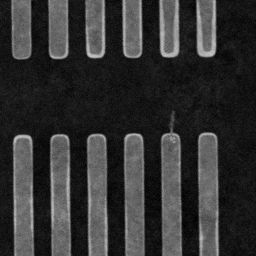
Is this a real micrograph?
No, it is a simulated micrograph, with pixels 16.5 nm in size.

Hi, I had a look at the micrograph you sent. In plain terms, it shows groups of lines, slits or small figures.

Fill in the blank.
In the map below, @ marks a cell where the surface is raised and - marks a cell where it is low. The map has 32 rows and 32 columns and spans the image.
--@@--@@---@@---@@--@@---@@-----
--@@--@@---@@---@@--@@---@@-----
--@@--@@---@@---@@--@@---@@-----
--@@--@@---@@---@@--@@---@@-----
--@@--@@---@@---@@--@@---@@-----
--@@--@@---@@---@@--@@---@@-----
--@@--@@---@@---@@--@@---@@-----
--------------------------------
--------------------------------
--------------------------------
--------------------------------
--------------------------------
--------------------------------
--------------------------------
--------------------------------
--------------------------------
--------------------------------
--@@--@@@--@@---@@--@@---@@-----
--@@--@@@--@@---@@--@@---@@-----
--@@--@@@--@@---@@--@@---@@-----
--@@--@@@--@@---@@--@@---@@-----
--@@--@@@--@@---@@--@@---@@-----
--@@--@@@--@@---@@--@@---@@-----
--@@--@@@--@@---@@--@@---@@-----
--@@---@@--@@---@@--@@@--@@-----
--@@---@@--@@---@@--@@@--@@-----
--@@---@@--@@---@@--@@@--@@-----
--@@---@@--@@---@@--@@@--@@-----
--@@---@@--@@---@@--@@@--@@-----
--@@--@@@--@@---@@--@@@--@@-----
--@@--@@@--@@---@@--@@@--@@-----
--@@--@@@--@@---@@--@@@--@@-----